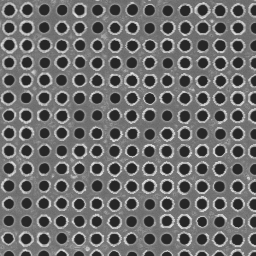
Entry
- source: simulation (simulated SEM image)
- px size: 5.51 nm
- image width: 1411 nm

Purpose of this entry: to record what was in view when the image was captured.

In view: a regular array of holes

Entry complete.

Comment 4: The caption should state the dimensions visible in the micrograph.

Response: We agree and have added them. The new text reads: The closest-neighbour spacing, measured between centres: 94.9 nanometers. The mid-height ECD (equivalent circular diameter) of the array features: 55.3 nanometers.